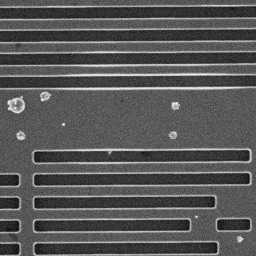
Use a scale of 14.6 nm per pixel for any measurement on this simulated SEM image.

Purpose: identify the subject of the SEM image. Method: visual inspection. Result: groups of lines, slits or small figures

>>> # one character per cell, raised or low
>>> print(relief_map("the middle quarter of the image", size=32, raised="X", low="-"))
XXXX--------XXXXXXXXXXXXXXXXXXXX
XXXXXXXXXXXXXXXXXXXXXXXXXXXXXXXX
XXXXXXXXXXXXXXXXXXXXXXXXXXXXX---
--------------------------------
--------------------------------
--------------------------------
XXXXXXXXXXXXXXXXXXXXXXXXXXXXXXXX
XXXXXXXXXXXXXXXXXXXXXXXXXXXXXXXX
XXXXXXXXXXXXXXXXXXXXXXXXXXXXXXXX
XXXXXXXXXXXXXXXXXXXXXXXXXXXXXXXX
XXXXXXXXXXXXXXXXXXXXXXXXXXXXXXXX
XXXXXXXXXXXXXXXXXXXXXXXXXXXXXXXX
XXXXXXXXXXXXXXXXXXXXXXXXXXXXXXXX
XXXXXXXXXXXXXXXXXXXXXXXXXXXXXXXX
XXXXXXXXXXXXXXXXXXXXXXXXXXXXXXXX
XXXXXXXXXXXXXXXXXXXXXXXXXXXXXXXX
XXXXXXXXXXXXXXXXXXXXXXXXXXXXXXXX
XXXXXXXXXXXXXXXXXXXXXXXXXXXXXXXX
XXXXXXXXXXXXXXXXXXXXXXXXXXXXXXXX
XXXXXXXXXXXXXXXXXXXXXXXXXXXXXXXX
XXXXXXXXXXXXXXXXXXXXXXXXXXXXXXXX
XXXXXXXXXXXXXXXXXXXXXXXXXXXXX---
--------------------------------
--------------------------------
---------------------------XXXXX
XXXXXXXXXXXXXXXXXXXXXXXXXXXXXXXX
XXXXXXXXXXXXXXXXXXXXXXXXXXXXXXXX
--------------------------------
--------------------------------
--------------------------------
XXXXXXXXXXXXXXXXXXXXXXXXXXXXXXXX
XXXXXXXXXXXXXXXXXXXXXXXXXXXXXXXX